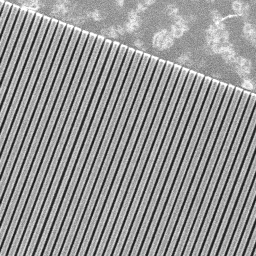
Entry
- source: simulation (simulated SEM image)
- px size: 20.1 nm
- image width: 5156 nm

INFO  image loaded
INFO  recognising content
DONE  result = parallel lines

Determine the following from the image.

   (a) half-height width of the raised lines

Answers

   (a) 125 nanometres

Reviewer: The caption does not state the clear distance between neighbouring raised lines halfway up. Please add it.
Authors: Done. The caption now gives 54.3 nm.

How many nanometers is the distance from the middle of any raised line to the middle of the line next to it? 164